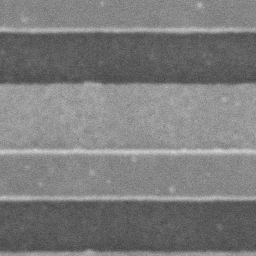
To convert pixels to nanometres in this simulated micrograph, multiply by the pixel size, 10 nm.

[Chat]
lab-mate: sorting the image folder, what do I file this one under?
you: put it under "lines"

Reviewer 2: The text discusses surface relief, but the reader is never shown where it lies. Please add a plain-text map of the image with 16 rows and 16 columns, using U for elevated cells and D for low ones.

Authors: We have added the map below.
UUUUUUUUUUUUUUUU
UUUUUUUUUUUUUUUU
DDDDDDDDDDDDDDDD
DDDDDDDDDDDDDDDD
DDDDDDDDDDDDDDDD
UUUUUUUUUUUUUUUU
UUUUUUUUUUUUUUUU
UUUUUUUUUUUUUUUU
UUUUUUUUUUUUUUUU
UUUUUUUUUUUUUUUU
UUUUUUUUUUUUUUUU
UUUUUUUUUUUUUUUU
DDDDDDDDDDDDDDDD
DDDDDDDDDDDDDDDD
DDDDDDDDDDDDDDDD
DDDDDDDDDDDDDDDD